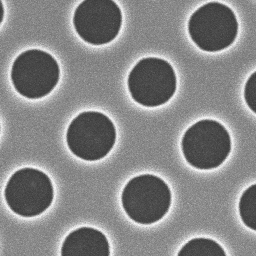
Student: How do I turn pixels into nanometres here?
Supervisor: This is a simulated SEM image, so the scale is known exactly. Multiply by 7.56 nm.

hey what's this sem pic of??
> holes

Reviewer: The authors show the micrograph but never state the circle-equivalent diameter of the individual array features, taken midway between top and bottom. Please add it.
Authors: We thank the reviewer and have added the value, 375 nanometres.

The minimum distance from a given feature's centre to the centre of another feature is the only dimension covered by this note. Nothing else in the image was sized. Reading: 614 nanometres